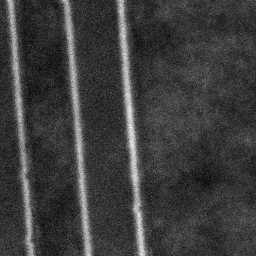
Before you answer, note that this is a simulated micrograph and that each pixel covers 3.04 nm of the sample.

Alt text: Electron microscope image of one or a few lines or trenches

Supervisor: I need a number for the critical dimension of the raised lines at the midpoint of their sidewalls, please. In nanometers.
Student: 165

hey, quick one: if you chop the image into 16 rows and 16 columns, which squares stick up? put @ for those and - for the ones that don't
@---@@@@--------
@---@@@@--------
@---@@@@--------
@---@@@@--------
@----@@@--------
@----@@@--------
@----@@@--------
@----@@@--------
@----@@@--------
@----@@@--------
@@---@@@--------
@@---@@@@-------
@@---@@@@-------
@@---@@@@-------
@@---@@@@-------
@@---@@@@-------